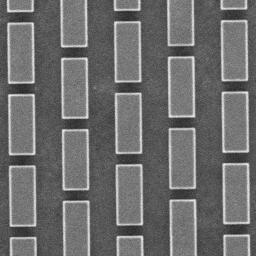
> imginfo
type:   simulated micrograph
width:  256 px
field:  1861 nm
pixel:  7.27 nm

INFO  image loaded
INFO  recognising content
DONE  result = groups of lines, slits or small figures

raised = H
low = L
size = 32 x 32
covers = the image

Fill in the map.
LHHHLLLLHHHLLLHHHLLLLHHHLLLLHHHL
LLLLLLLLHHHLLLLLLLLLLHHHLLLLLLLL
LLLLLLLLHHHLLLLLLLLLLHHHLLLLLLLL
LHHHLLLLHHHLLLHHHLLLLHHHLLLLHHHL
LHHHLLLLHHHLLLHHHLLLLHHHLLLLHHHL
LHHHLLLLHHHLLLHHHLLLLHHHLLLLHHHL
LHHHLLLLLLLLLLHHHLLLLLLLLLLLHHHL
LHHHLLLLHHHLLLHHHLLLLHHHLLLLHHHL
LHHHLLLLHHHLLLHHHLLLLHHHLLLLHHHL
LHHHLLLLHHHLLLHHHLLLLHHHLLLLHHHL
LLLLLLLLHHHLLLLLLLLLLHHHLLLLLLLL
LLLLLLLLHHHLLLLLLLLLLHHHLLLLLLLL
LHHHLLLLHHHLLLHHHHLLLHHHLLLLHHHL
LHHHLLLLHHHLLLLHHHLLLHHHLLLLHHHL
LHHHLLLLHHHLLLLHHHLLLHHHLLLLHHHL
LHHHLLLLLLLLLLLHHHLLLLLLLLLLHHHL
LHHHLLLLHHHLLLLHHHLLLHHHLLLLHHHL
LHHHLLLLHHHLLLLHHHLLLHHHLLLLHHHL
LHHHLLLLHHHLLLLHHHLLLHHHLLLLHHHL
LLLLLLLLHHHLLLLLLLLLLHHHLLLLLLLL
LLLLLLLLHHHLLLLLLLLLLHHHLLLLLLLL
LHHHLLLLHHHLLLLHHHLLLHHHLLLLHHHL
LHHHLLLLHHHLLLLHHHLLLHHHLLLLHHHL
LHHHLLLLHHHLLLLHHHLLLLHHLLLLHHHL
LHHHLLLLLLLLLLLHHHLLLLLLLLLLHHHL
LHHHLLLLHHHLLLLHHHLLLHHHLLLLHHHL
LHHHLLLLHHHLLLLHHHLLLHHHLLLLHHHL
LHHHLLLLHHHLLLLHHHLLLHHHLLLLHHHL
LLLLLLLLHHHLLLLLLLLLLHHHLLLLLLLL
LLLLLLLLHHHLLLLLLLLLLHHHLLLLHHHL
LHHHLLLLHHHLLLLHHHLLLHHHLLLLHHHL
LHHHLLLLHHHLLLLHHHLLLHHHLLLLHHHL